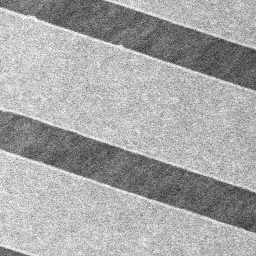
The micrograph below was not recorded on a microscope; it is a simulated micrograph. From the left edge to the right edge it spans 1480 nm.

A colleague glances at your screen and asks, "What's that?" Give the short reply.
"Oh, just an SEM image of one or a few lines or trenches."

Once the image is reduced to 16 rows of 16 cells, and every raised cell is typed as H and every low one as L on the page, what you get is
LLLLLLLLHHHHHHHH
HHHLLLLLLLLHHHHH
HHHHHHLLLLLLLLHH
HHHHHHHHHLLLLLLL
HHHHHHHHHHHHLLLL
HHHHHHHHHHHHHHHL
HHHHHHHHHHHHHHHH
LLHHHHHHHHHHHHHH
LLLLLHHHHHHHHHHH
LLLLLLLLHHHHHHHH
HHHLLLLLLLLLHHHH
HHHHHHLLLLLLLLLH
HHHHHHHHHLLLLLLL
HHHHHHHHHHHHHLLL
HHHHHHHHHHHHHHHL
LHHHHHHHHHHHHHHH